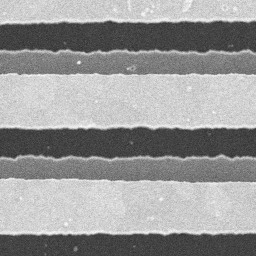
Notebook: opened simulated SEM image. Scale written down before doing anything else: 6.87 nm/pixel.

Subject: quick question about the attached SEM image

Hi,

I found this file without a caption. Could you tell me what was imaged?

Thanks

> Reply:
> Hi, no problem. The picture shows lines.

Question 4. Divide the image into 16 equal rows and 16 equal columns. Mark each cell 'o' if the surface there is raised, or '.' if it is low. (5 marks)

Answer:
oooooooooooooooo
................
................
oooooooooooooooo
oooooooooooooooo
oooooooooooooooo
oooooooooooooooo
oooooooooooooooo
................
................
oooooooooooooooo
oooooooooooooooo
oooooooooooooooo
oooooooooooooooo
oooooooooooooooo
................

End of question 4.